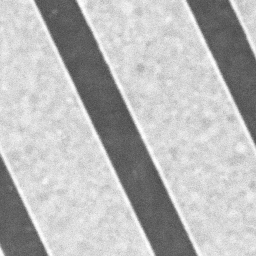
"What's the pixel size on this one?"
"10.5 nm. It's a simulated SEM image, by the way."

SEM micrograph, one or a few lines or trenches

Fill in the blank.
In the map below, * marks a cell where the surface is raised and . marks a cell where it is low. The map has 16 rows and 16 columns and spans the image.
**...*******...*
***...******...*
***...*******...
****...******...
****...*******..
*****...******..
*****...*******.
******..*******.
******...*******
******...*******
.******...******
.******...******
..******...*****
..******...*****
..*******...****
...******...****